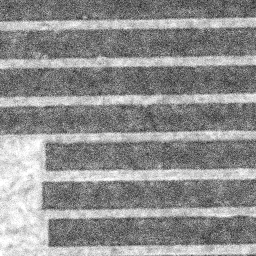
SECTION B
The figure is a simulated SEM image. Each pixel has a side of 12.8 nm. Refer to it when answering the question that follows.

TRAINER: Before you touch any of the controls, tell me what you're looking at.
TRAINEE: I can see parallel lines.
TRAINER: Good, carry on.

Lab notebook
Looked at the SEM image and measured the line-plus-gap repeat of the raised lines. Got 482 nanometres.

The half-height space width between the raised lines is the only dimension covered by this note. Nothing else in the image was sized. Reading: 383 nm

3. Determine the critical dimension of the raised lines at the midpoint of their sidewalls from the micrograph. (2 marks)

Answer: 98.9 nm